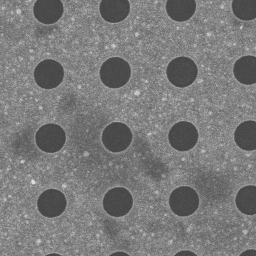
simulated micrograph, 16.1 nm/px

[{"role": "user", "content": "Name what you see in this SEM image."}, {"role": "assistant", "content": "a regular array of holes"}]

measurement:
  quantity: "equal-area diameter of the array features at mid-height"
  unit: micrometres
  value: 0.49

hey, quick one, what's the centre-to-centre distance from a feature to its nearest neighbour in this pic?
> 1040 nanometres